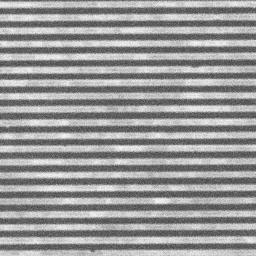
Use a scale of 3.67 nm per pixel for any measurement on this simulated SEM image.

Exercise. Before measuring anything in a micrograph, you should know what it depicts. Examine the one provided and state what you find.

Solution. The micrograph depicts parallel lines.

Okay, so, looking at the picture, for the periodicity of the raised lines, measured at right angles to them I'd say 48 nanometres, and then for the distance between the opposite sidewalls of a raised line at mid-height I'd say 0.0188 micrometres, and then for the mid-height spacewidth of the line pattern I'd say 28.9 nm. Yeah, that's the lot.